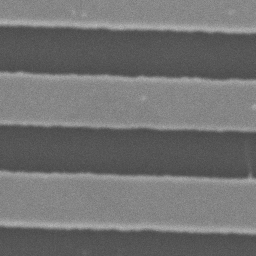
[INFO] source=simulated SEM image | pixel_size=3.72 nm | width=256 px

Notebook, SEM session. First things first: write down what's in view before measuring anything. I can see lines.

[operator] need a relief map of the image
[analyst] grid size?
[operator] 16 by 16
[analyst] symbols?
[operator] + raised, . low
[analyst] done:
++++++++++++++++
..++++++++++++++
................
................
................
++++++++++++++++
++++++++++++++++
++++++++++++++++
................
................
................
++++++++++++++++
++++++++++++++++
++++++++++++++++
...............+
................